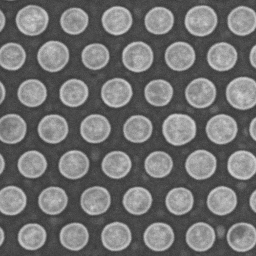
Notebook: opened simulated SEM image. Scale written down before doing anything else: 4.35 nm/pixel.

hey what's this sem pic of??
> a regular array of raised bodies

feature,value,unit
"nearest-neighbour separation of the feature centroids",0.18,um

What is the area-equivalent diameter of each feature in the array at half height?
120 nanometers